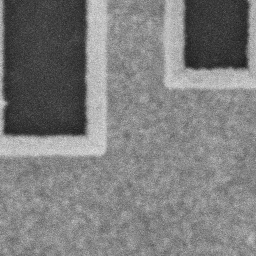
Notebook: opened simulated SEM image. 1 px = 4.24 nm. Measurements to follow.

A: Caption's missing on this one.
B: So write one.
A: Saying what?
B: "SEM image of one or a few lines or trenches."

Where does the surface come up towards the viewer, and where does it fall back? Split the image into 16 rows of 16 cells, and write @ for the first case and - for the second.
------@@@@@-----
------@@@@@-----
------@@@@@-----
------@@@@@-----
------@@@@@-----
------@@@@@@@@@@
------@@@@@@@@@@
------@@@@@@@@@@
------@@@@@@@@@@
@@@@@@@@@@@@@@@@
@@@@@@@@@@@@@@@@
@@@@@@@@@@@@@@@@
@@@@@@@@@@@@@@@@
@@@@@@@@@@@@@@@@
@@@@@@@@@@@@@@@@
@@@@@@@@@@@@@@@@